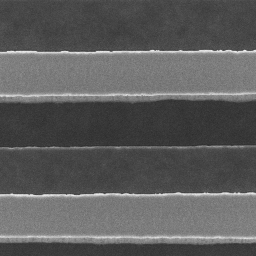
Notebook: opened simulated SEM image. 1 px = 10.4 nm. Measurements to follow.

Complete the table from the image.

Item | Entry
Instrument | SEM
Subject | lines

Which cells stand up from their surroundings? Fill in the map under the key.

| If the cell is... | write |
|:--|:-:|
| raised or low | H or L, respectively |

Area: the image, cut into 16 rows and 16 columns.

HHHHHHHHHHHHHHHH
HHHHHHHHHHHHHHHH
HHHHHHHHHHHHHHHH
HHHHHHHHHHHHHHHH
HHHHHHHHHHHHHHHH
HHHHHHHHHHHHHHHH
LLLLLLLLLLLLLLLL
LLLLLLLLLLLLLLLL
LLLLLLLLLLLLLLLL
HHHHHHHHHHHHHHHH
HHHHHHHHHHHHHHHH
HHHHHHHHHHHHHHHH
HHHHHHHHHHHHHHHH
HHHHHHHHHHHHHHHH
HHHHHHHHHHHHHHHH
LLLLLLLLLLLLLLLL